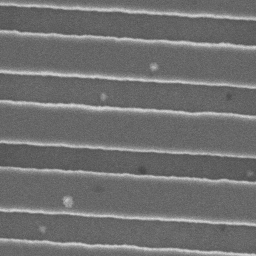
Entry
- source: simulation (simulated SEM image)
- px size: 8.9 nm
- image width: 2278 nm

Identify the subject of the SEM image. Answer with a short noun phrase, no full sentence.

lines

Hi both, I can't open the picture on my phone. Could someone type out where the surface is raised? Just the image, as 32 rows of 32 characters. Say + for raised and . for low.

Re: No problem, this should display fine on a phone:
++++++++++++++++++++++++++++++++
...............+++++++++++++++++
................................
................................
++++++++++++....................
+++++++++++++++++++++++++++++...
++++++++++++++++++++++++++++++++
++++++++++++++++++++++++++++++++
++++++++++++++++++++++++++++++++
.......+++++++++++++++++++++++++
........................++++++++
................................
................................
+++++++++++++++.................
+++++++++++++++++++++++++++++++.
++++++++++++++++++++++++++++++++
++++++++++++++++++++++++++++++++
++++++++++++++++++++++++++++++++
...........+++++++++++++++++++++
...........................+++++
................................
++++++++++++....................
+++++++++++++++++++++++++++++...
++++++++++++++++++++++++++++++++
++++++++++++++++++++++++++++++++
++++++++++++++++++++++++++++++++
...+++++++++++++++++++++++++++++
....................++++++++++++
................................
................................
+++++++++++.....................
++++++++++++++++++++++++++++....